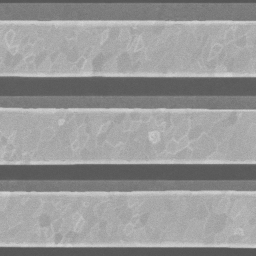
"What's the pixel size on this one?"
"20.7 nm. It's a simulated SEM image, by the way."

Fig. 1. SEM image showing lines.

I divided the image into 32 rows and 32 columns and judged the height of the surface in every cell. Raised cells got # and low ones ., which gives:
################################
################################
################################
################################
################################
################################
################################
################################
################################
################################
................................
................................
################################
################################
################################
################################
################################
################################
################################
################################
###########..####...............
................................
................................
################################
################################
################################
################################
################################
################################
################################
################################
................................